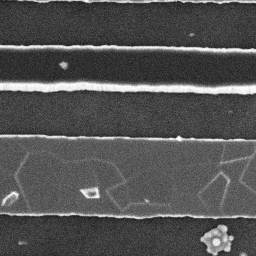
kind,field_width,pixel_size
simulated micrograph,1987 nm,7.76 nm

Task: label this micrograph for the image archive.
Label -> lines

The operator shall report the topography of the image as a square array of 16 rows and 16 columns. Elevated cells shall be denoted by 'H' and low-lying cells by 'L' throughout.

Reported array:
LLLLLLLLLLLLLLLL
LLLLLLLLLLLLLLLL
LLLLLLLLLLLLLLLL
HHHHHHHHHHHHHHHH
HHHHHHHHHHHHHHHH
LLLLLLLHHHHHHHHH
LLLLLLLLLLLLLLLL
LLLLLLLLLLLLLLLL
HHHLLLLLLLLLLLLL
HHHHHHHHHHHHHHHH
HHHHHHHHHHHHHHHH
HHHHHHHHHHHHHHHH
HHHHHHHHHHHHHHHH
LLLLLLHHHHHHHHHH
LLLLLLLLLLLLLLLL
LLLLLLLLLLLLLLLL